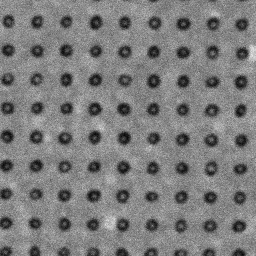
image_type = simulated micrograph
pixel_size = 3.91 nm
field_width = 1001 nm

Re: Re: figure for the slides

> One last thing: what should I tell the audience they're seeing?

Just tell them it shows a regular array of ring-shaped grooves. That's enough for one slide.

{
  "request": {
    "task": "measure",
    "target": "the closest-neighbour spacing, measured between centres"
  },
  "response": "0.112 micrometres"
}